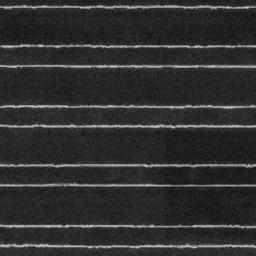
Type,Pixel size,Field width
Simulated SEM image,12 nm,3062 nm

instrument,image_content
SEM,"lines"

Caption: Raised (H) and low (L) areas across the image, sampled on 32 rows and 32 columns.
HHHHHHHHHHHHHHHHHHHHHHHHHHHHHHHH
LLLLLLLLLLLLLLLLLLLLLLLLLLLLLLLL
LLLLLLLLLLLLLLLLLLLLLLLLLLLLLLLL
LLLLLLLLLLLLLLLLLLLLLLLLLLLLLLLL
LLLLLLLLLLLLLLLLLLLLLLLLLLLLLLLL
LLLLLLLLLLLLLLLLLLLLLLLLLLLLLLLL
HHHHHHHHHHHHHHHHHHHHHHHHHHHHHHHH
HHHHHHHHHHHHHHHHHHHHHHHHHHHHHHHH
LLLLLLLLLLLLLLLLLLLLLLLLLLLLLLLL
LLLLLLLLLLLLLLLLLLLLLLLLLLLLLLLL
LLLLLLLLLLLLLLLLLLLLLLLLLLLLLLLL
LLLLLLLLLLLLLLLLLLLLLLLLLLLLLLLL
LLLLLLLLLLLLLLLLLLLLLLLLLLLLLLLL
HHHHHHHHHHHHHHHHHHHHHHHHHHHHHHHH
HHHHHHHHHHHHHHHHHHHHHHHHHHHHHHHH
HHHHHHHHHHHHHHHHHHHHHHHHHHHHHHHH
LLLLLLLLLLLLLLLLLLLLLLLLLLLLLLLL
LLLLLLLLLLLLLLLLLLLLLLLLLLLLLLLL
LLLLLLLLLLLLLLLLLLLLLLLLLLLLLLLL
LLLLLLLLLLLLLLLLLLLLLLLLLLLLLLLL
LLLLLLLLLLLLLLLLLLLLLLLLLLLLLLLL
HHHHHHHHHHHHHHHHHHHHHHHHHHHHHHHH
HHHHHHHHHHHHHHHHHHHHHHHHHHHHHHHH
LLLLLLLLLLLLLLLLLLLLLLLLLLLLLLLL
LLLLLLLLLLLLLLLLLLLLLLLLLLLLLLLL
LLLLLLLLLLLLLLLLLLLLLLLLLLLLLLLL
LLLLLLLLLLLLLLLLLLLLLLLLLLLLLLLL
LLLLLLLLLLLLLLLLLLLLLLLLLLLLLLLL
HHHHHHHHHHHHHHHHHHHHHHHHHHHHHHHH
HHHHHHHHHHHHHHHHHHHHHHHHHHHHHHHH
HHHHHHHHHHHHHHHHHHHHHHHHHHHHHHHH
LLLLLLLLLLLLLLLLLLLLLLLLLLLLLLLL